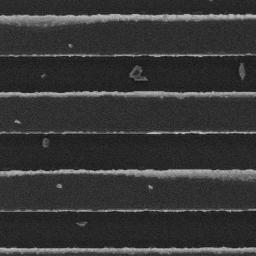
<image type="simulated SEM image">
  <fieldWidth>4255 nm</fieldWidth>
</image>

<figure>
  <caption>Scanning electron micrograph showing lines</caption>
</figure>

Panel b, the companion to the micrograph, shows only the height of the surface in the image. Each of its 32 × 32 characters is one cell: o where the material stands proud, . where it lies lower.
................................
................................
oooooooooooooooooooooooooooooooo
oooooooooooooooooooooooooooooooo
oooooooooooooooooooooooooooooooo
oooooooooooooooooooooooooooooooo
oooooooooooooooooooooooooooooooo
................................
................................
................................
................................
................................
oooooooooooooooooooooooooooooooo
oooooooooooooooooooooooooooooooo
oooooooooooooooooooooooooooooooo
oooooooooooooooooooooooooooooooo
oooooooooooooooooooooooooooooooo
................................
................................
................................
................................
...oooooooooooooooo.............
oooooooooooooooooooooooooooooooo
oooooooooooooooooooooooooooooooo
oooooooooooooooooooooooooooooooo
oooooooooooooooooooooooooooooooo
................................
................................
................................
................................
................................
oooooooooooooooooooooooooooooooo